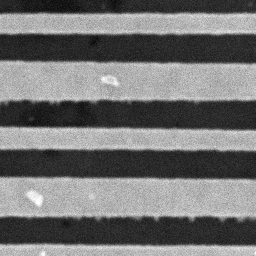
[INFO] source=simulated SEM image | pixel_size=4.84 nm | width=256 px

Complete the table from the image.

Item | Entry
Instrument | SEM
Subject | lines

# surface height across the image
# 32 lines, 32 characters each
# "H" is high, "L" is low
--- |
LLLLLLLLLLLLLLLLLLLLLLLLLLLLLLLL
LLLLLLLLLLLLLLLLLLLLLLLLLLLLLLLL
HHHHHHHHHHHHHHHHHHHHHHHHHHHHHHHH
HHHHHHHHHHHHHHHHHHHHHHHHHHHHHHHH
LLLLLLLLLLLLLLLLLLLLLLLLLLLLLLLL
LLLLLLLLLLLLLLLLLLLLLLLLLLLLLLLL
LLLLLLLLLLLLLLLLLLLLLLLLLLLLLLLL
LLLLLLLLLLLLLLLLLLLLLLLLLLLLLLLL
HHHHHHHHHHHHHHHHHHHHHHHHHHHHHHHH
HHHHHHHHHHHHHHHHHHHHHHHHHHHHHHHH
HHHHHHHHHHHHHHHHHHHHHHHHHHHHHHHH
HHHHHHHHHHHHHHHHHHHHHHHHHHHHHHHH
LHLLLLHHLLLLLLLLLLLLLLLLLLLLLLLL
LLLLLLLLLLLLLLLLLLLLLLLLLLLLLLLL
LLLLLLLLLLLLLLLLLLLLLLLLLLLLLLLL
LLLLLLLLLLLLLLLLLLLLLLLLLLLLLLLL
HHHHHHHHHHHHHHHHHHHHHHHHHHHHHHHH
HHHHHHHHHHHHHHHHHHHHHHHHHHHHHHHH
HHHHHHHHHHHHHHHHHHHHHHHHHHHHHHHH
LLLLLLLLLLLLLLLLLLLLLLLLLLLLLLLL
LLLLLLLLLLLLLLLLLLLLLLLLLLLLLLLL
LLLLLLLLLLLLLLLLLLLLLLLLLLLLLLLL
HHHHHHHHHHHHHHHHHHHHHHHHHHHHHHHH
HHHHHHHHHHHHHHHHHHHHHHHHHHHHHHHH
HHHHHHHHHHHHHHHHHHHHHHHHHHHHHHHH
HHHHHHHHHHHHHHHHHHHHHHHHHHHHHHHH
HHHHHHHHHHHHHHHHHHHHHHHHHHHHHHHH
LLLLLLLLLLLLLLLLLLLLLLLLLLLLLLLL
LLLLLLLLLLLLLLLLLLLLLLLLLLLLLLLL
LLLLLLLLLLLLLLLLLLLLLLLLLLLLLLLL
LLLLLLLLLLLLLLLLLLLLLLLLLLLLLLLL
HHHHHHHHHHHHHHHHHHHHHHHHHHHHHHHH